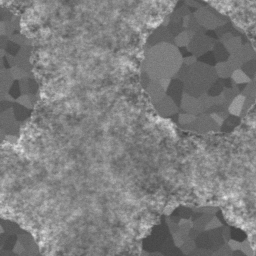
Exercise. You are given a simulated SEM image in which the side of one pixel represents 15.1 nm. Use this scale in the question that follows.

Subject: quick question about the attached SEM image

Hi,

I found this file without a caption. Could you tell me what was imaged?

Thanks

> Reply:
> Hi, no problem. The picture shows raised bodies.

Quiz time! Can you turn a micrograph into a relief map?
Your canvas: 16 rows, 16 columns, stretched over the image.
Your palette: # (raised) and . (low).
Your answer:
...........##...
#.........#####.
##.......#######
##.......#######
##.......#######
##.......#######
##.......#######
##........#####.
#...............
................
................
................
................
..........####..
##.......######.
##.......#######